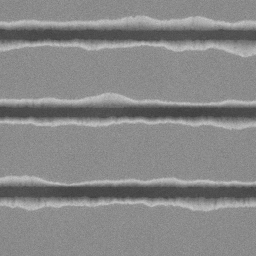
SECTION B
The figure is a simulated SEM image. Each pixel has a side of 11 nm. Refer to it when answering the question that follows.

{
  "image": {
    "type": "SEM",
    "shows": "lines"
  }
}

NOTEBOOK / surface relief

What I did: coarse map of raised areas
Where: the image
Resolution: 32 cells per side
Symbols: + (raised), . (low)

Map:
++++++++++++++++++++++++++++++++
++++++++++++++++++++++++++++++++
++++++++++++++++++++++++++++++++
................................
................................
+++++++++++++++++++++++++++++...
++++++++++++++++++++++++++++++++
++++++++++++++++++++++++++++++++
++++++++++++++++++++++++++++++++
++++++++++++++++++++++++++++++++
++++++++++++++++++++++++++++++++
++++++++++++++++++++++++++++++++
++++++++++++++++++++++++++++++++
................................
................................
++++++++++++++++++++++++++++++++
++++++++++++++++++++++++++++++++
++++++++++++++++++++++++++++++++
++++++++++++++++++++++++++++++++
++++++++++++++++++++++++++++++++
++++++++++++++++++++++++++++++++
++++++++++++++++++++++++++++++++
++++++++++++++++++++++++++++++++
................................
................................
++++++++++++++++++++++++++++++++
++++++++++++++++++++++++++++++++
++++++++++++++++++++++++++++++++
++++++++++++++++++++++++++++++++
++++++++++++++++++++++++++++++++
++++++++++++++++++++++++++++++++
++++++++++++++++++++++++++++++++